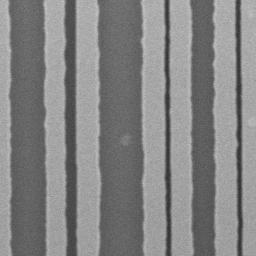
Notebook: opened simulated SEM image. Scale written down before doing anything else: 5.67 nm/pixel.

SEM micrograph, lines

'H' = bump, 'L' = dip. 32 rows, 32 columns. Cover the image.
HLLLLLHHLLHHLLLLLLHHHHHHLLLHHLHH
HLLLLLHHLLHHLLLLLLHHHHHHLLLHHLHH
HLLLLLHHLLHHLLLLLLHHHHHHLLLHHLHH
HLLLLLHHLLHHLLLLLLHHHHHHLLLHHLHH
HLLLLLHHLLHHLLLLLLHHHHHHLLLHHLHH
HLLLLLHHLLHHLLLLLLHHHHHHLLLHHLHH
HLLLLLHHLLHHLLLLLLHHHHHHLLLHHLHH
HLLLLLHHLLHHLLLLLLHHHHHHLLLHHLHH
HLLLLLHHLLHHLLLLLLHHHHHHLLLHHLHH
HLLLLLHHLLHHLLLLLLHHHHHHLLLHHLHH
HLLLLLHHLLHHLLLLLLHHHHHHLLLHHLHH
HLLLLLHHLLHHLLLLLLHHHHHHLLLHHLHH
HLLLLLHHLLHHLLLLLLHHHHHHLLLHHLHH
HLLLLLHHLLHHLLLLLLHHHHHHLLLHHLHH
HLLLLLHHLLHHLLLLLLHHHHHHLLLHHHHH
HLLLLLHHLLHHLLLLLLHHHHHHLLLHHHHH
HLLLLLHHLLHHLLLLLLHHHHHHLLLHHHHH
HLLLLLHHLLHHLLLLLLHHHHHHLLLHHHHH
HLLLLLHHLLHHLLLLLLHHHHHHLLLHHHHH
HLLLLLHHLLHHLLLLLLHHHHHHLLLHHLHH
HLLLLLHHLLHHLLLLLLHHHHHHLLLHHHHH
HLLLLLHHLLHHLLLLLLHHHHHHLLLHHHHH
HLLLLLHHLLHHLLLLLLHHHHHHLLLHHHHH
HLLLLLHHLLHHLLLLLLHHHHHHLLLHHHHH
HLLLLLHHLLHHLLLLLLHHHHHHLLLHHHHH
HLLLLLHHLLHHLLLLLLHHHHHHLLLHHHHH
HLLLLLHHLLHHLLLLLLHHHHHHLLLHHHHH
HLLLLLHHLLHHLLLLLLHHHHHHLLLHHHHH
HLLLLLHHLLHHLLLLLLHHHHHHLLLHHHHH
HLLLLLHHLLHHLLLLLLHHHHHHLLLHHHHH
HLLLLLHHLLHHLLLLLLHHHHHHLLLHHHHH
HLLLLLHHLLHHLLLLLLHHHHHHLLLHHHHH